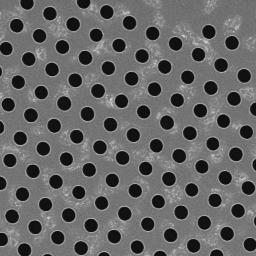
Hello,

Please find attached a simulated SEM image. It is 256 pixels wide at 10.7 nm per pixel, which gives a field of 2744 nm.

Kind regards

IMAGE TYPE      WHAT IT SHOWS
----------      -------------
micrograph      a regular array of holes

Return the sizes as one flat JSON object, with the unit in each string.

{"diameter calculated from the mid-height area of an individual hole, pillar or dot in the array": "144 nanometers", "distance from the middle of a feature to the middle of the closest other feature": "266 nm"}